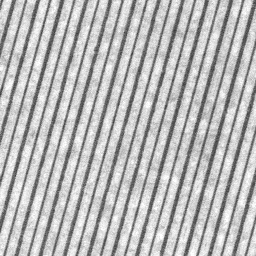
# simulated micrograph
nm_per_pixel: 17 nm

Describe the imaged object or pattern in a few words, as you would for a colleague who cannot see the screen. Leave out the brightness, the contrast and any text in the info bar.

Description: parallel lines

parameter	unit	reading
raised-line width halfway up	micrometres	0.131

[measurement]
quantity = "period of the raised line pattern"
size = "198 nm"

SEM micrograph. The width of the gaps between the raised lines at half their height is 65.6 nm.